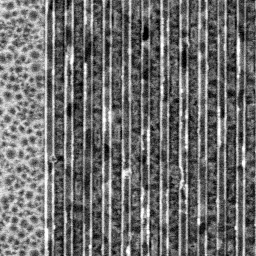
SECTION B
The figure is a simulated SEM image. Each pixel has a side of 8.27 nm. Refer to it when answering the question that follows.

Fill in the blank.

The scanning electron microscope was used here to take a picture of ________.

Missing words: parallel lines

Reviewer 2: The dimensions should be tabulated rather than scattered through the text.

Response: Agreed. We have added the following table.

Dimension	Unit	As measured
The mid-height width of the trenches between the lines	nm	89.9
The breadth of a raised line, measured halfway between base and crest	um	0.0672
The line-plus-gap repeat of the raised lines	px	19.1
